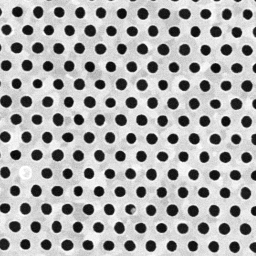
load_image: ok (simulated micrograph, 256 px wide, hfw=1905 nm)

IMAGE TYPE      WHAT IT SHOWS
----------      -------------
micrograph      a regular array of holes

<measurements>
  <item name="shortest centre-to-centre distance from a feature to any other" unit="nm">151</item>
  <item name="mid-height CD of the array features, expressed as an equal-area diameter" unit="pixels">11.6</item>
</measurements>